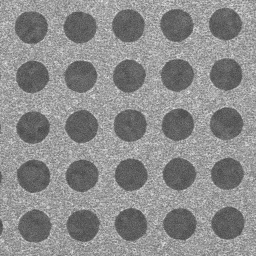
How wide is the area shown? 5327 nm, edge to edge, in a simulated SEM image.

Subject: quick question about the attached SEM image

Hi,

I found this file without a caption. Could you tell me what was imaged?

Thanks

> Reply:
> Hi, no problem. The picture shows a regular array of raised bodies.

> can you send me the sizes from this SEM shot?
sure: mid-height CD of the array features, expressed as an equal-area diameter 718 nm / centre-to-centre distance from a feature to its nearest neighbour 1010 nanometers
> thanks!